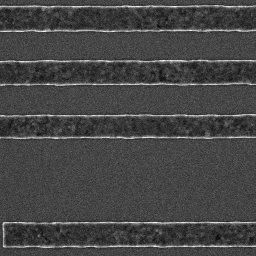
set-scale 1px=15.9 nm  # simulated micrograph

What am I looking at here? wiring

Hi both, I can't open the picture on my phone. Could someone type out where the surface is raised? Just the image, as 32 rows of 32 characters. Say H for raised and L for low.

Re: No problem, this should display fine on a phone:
LLLLLLLLLLLLLLLLLLLLLLLLLLLLLLLL
HHHHHHHHHHHHHHHHHHHHHHHHHHHHHHHH
HHHHHHHHHHHHHHHHHHHHHHHHHHHHHHHH
HHHHHHHHHHHHHHHHHHHHHHHHHHHHHHHH
LLLLLLLLLLLLLLLLLLLLLLLLLLLLLLLL
LLLLLLLLLLLLLLLLLLLLLLLLLLLLLLLL
LLLLLLLLLLLLLLLLLLLLLLLLLLLLLLLL
LLLLLLLLLLLLLLLLLLLLLLLLLLLLLLLL
HHHHHHHHHHHHHHHHHHHHHHHHHHHHHHHH
HHHHHHHHHHHHHHHHHHHHHHHHHHHHHHHH
HHHHHHHHHHHHHHHHHHHHHHHHHHHHHLLH
LLLLLLLLLLLLLLLLLLLLLLLLLLLLLLLL
LLLLLLLLLLLLLLLLLLLLLLLLLLLLLLLL
LLLLLLLLLLLLLLLLLLLLLLLLLLLLLLLL
HHHHHHHHHHHHHHHHHHHHHHHHHHHHHHHH
HHHHHHHHHHHHHHHHHHHHHHHHHHHHHHHH
HHHHHHHHHHHHHHHHHHHHHHHHHHHHHHHH
LLLLLLLLLLLLLLLLLLLLLLLLLLLLLLLL
LLLLLLLLLLLLLLLLLLLLLLLLLLLLLLLL
LLLLLLLLLLLLLLLLLLLLLLLLLLLLLLLL
LLLLLLLLLLLLLLLLLLLLLLLLLLLLLLLL
LLLLLLLLLLLLLLLLLLLLLLLLLLLLLLLL
LLLLLLLLLLLLLLLLLLLLLLLLLLLLLLLL
LLLLLLLLLLLLLLLLLLLLLLLLLLLLLLLL
LLLLLLLLLLLLLLLLLLLLLLLLLLLLLLLL
LLLLLLLLLLLLLLLLLLLLLLLLLLLLLLLL
LLLLLLLLLLLLLLLLLLLLLLLLLLLLLLLL
LLLLLLLLLLLLLLLLLLLLLLLLLLLLLLLL
HHHHHHHHHHHHHHHHHHHHHHHHHHHHHHHH
HHHHHHHHHHHHHHHHHHHHHHHHHHHHHHHH
HHHHHHHHHHHHHHHHHHHHHHHHHHHHHHHH
LLLLLLLLLLLLLLLLLLLLLLLLLLLLLLLL